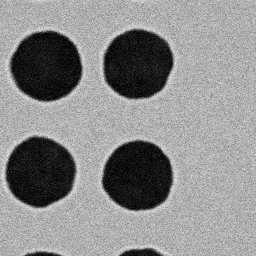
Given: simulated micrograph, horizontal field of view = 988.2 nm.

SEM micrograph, holes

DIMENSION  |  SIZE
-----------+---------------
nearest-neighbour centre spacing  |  364 nm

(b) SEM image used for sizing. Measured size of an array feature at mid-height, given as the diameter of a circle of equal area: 273 nanometers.